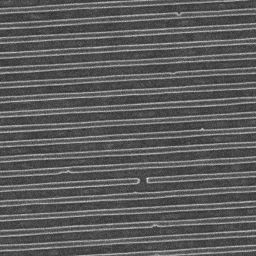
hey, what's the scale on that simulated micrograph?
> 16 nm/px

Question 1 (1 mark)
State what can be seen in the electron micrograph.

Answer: parallel lines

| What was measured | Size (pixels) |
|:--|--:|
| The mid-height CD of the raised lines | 5.24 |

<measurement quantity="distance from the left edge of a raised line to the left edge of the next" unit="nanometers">237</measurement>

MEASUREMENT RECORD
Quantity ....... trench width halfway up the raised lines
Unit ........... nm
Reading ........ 150